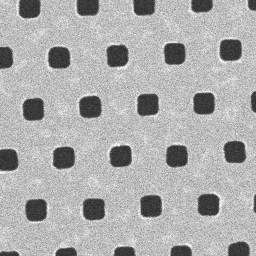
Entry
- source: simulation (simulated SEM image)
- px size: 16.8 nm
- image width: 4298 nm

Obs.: a regular array of holes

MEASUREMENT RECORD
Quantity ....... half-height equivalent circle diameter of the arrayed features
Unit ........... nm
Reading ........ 398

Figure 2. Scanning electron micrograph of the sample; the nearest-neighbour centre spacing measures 955 nm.